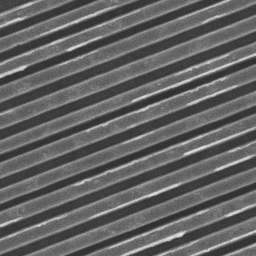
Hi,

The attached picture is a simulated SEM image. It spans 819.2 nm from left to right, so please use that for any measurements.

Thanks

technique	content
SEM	parallel lines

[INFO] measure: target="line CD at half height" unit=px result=14.7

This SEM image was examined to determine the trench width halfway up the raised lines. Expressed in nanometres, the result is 30.2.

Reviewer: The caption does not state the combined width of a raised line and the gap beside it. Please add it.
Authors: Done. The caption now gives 23.5 pixels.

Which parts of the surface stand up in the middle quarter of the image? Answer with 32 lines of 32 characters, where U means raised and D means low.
UUUUUUUDDDDDDDDUUUUUUUUUUDDDDDDD
UUUUUDDDDDDDUUUUUUUUUUUDDDDDDDUU
UUDDDDDDDDUUUUUUUUUUDDDDDDDUUUUU
DDDDDDDUUUUUUUUUUDDDDDDDDUUUUUUU
DDDDDUUUUUUUUUUDDDDDDDUUUUUUUUUD
DDUUUUUUUUUUDDDDDDDDUUUUUUUUUDDD
UUUUUUUUUUDDDDDDDUUUUUUUUUDDDDDU
UUUUUUUDDDDDDDUUUUUUUUUDDDDDDUUU
UUUUDDDDDDDDUUUUUUUUUDDDDDUUUUUU
UUDDDDDDDUUUUUUUUUDDDDDUUUUUUUUU
DDDDDDDUUUUUUUUUDDDDDUUUUUUUUUUD
DDDDUUUUUUUUUDDDDDUUUUUUUUUUUDDD
DUUUUUUUUUDDDDDUUUUUUUUUUUDDDDDD
UUUUUUUUDDDDDUUUUUUUUUUDDDDDDDDU
UUUUUDDDDDDUUUUUUUUUUDDDDDDDUUUU
UUUDDDDDUUUUUUUUUUDDDDDDDDUUUUUU
DDDDDUUUUUUUUUUUDDDDDDDUUUUUUUUU
DDUUUUUUUUUUUDDDDDDDUUUUUUUUUDDD
UUUUUUUUUUDDDDDDDDUUUUUUUUUDDDDD
UUUUUUUUDDDDDDDUUUUUUUUUDDDDDDUU
UUUUUDDDDDDDDUUUUUUUUDDDDDDUUUUU
UUUDDDDDDUUUUUUUUUUDDDDDUUUUUUUU
DDDDDDDUUUUUUUUUDDDDDDUUUUUUUUUU
DDDDDUUUUUUUUUDDDDDUUUUUUUUUUDDD
DDUUUUUUUUUUDDDDDUUUUUUUUUUDDDDD
UUUUUUUUUDDDDDUUUUUUUUUUDDDDDDDU
UUUUUUDDDDDUUUUUUUUUUUDDDDDDDUUU
UUUDDDDDDUUUUUUUUUUDDDDDDDUUUUUU
UDDDDDUUUUUUUUUUDDDDDDDDUUUUUUUU
DDDDUUUUUUUUUUDDDDDDUUUUUUUUUUUD
DUUUUUUUUUUDDDDDDDUUUUUUUUUUUDDD
UUUUUUUUUDDDDDDUUUUUUUUUUUDDDDDD